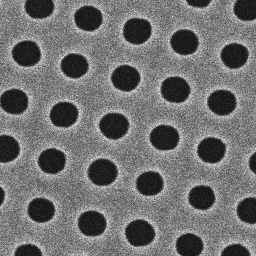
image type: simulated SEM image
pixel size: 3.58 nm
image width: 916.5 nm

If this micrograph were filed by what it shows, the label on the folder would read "a regular array of holes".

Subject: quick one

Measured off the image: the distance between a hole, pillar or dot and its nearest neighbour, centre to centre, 48.4 px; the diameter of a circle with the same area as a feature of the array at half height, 96.6 nm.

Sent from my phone